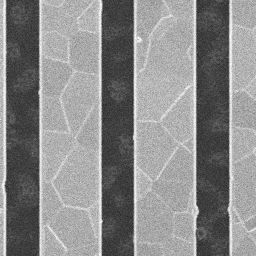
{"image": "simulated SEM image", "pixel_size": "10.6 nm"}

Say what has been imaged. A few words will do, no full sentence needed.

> one or a few lines or trenches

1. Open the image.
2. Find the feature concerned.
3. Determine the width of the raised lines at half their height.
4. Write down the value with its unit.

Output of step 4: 0.625 µm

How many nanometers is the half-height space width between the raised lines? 375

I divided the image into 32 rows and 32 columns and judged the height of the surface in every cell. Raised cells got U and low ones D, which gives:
DDDDDUUUUUUUUDDDDUUUUUUUDDDDDUUU
DDDDDUUUUUUUUDDDDUUUUUUUDDDDDUUU
DDDDDUUUUUUUDDDDDUUUUUUUDDDDDUUU
DDDDDUUUUUUUDDDDDUUUUUUUDDDDDUUU
DDDDDUUUUUUUDDDDDUUUUUUUDDDDDUUU
DDDDDUUUUUUUDDDDDUUUUUUUDDDDDUUU
DDDDDUUUUUUUDDDDDUUUUUUUDDDDDUUU
DDDDDUUUUUUUDDDDDUUUUUUUDDDDDUUU
DDDDDUUUUUUUDDDDDUUUUUUUDDDDDUUU
DDDDDUUUUUUUDDDDDUUUUUUUDDDDDUUU
DDDDDUUUUUUUDDDDDUUUUUUUDDDDDUUU
DDDDDUUUUUUUDDDDDUUUUUUUDDDDDUUU
DDDDDUUUUUUUDDDDDUUUUUUUDDDDDUUU
DDDDDUUUUUUUDDDDDUUUUUUUDDDDDUUU
DDDDDUUUUUUUDDDDDUUUUUUUDDDDDUUU
UDDDDUUUUUUUDDDDDUUUUUUUDDDDDUUU
UDDDDUUUUUUUDDDDDUUUUUUUDDDDDUUU
UDDDDUUUUUUUDDDDDUUUUUUUDDDDDUUU
UDDDDUUUUUUUDDDDDUUUUUUUDDDDDUUU
UDDDDUUUUUUUDDDDDUUUUUUUDDDDDUUU
UDDDDUUUUUUUDDDDDUUUUUUUDDDDDUUU
UDDDDUUUUUUUDDDDDUUUUUUUDDDDDUUU
UDDDDUUUUUUUDDDDDUUUUUUUDDDDDUUU
UDDDDUUUUUUUDDDDDUUUUUUUDDDDDUUU
UDDDDUUUUUUUDDDDDUUUUUUUDDDDDUUU
UDDDDUUUUUUUDDDDDUUUUUUUDDDDDUUU
UDDDDUUUUUUUDDDDDUUUUUUUUDDDDUUU
UDDDDUUUUUUUUDDDDUUUUUUUDDDDDUUU
UDDDDUUUUUUUDDDDDUUUUUUUDDDDDUUU
UDDDDUUUUUUUDDDDDUUUUUUUDDDDDUUU
UDDDDUUUUUUUDDDDDUUUUUUUDDDDDUUU
UDDDDUUUUUUUDDDDDUUUUUUUDDDDDUUU